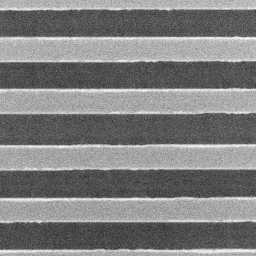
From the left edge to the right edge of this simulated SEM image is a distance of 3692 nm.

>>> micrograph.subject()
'lines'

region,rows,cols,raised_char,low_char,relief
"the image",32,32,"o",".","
oooooooooooooooooooooooooooooooo
................................
................................
................................
................................
oooooooooooooooooooooooooooooooo
oooooooooooooooooooooooooooooooo
oooooooooooooooooooooooooooooooo
................................
................................
................................
oooooooooooooooooooooooooooooooo
oooooooooooooooooooooooooooooooo
oooooooooooooooooooooooooooooooo
................................
................................
................................
................................
oooooooooooooooooooooooooooooooo
oooooooooooooooooooooooooooooooo
oooooooooooooooooooooooooooooooo
................................
................................
................................
................................
oooooooooooooooooooooooooooooooo
oooooooooooooooooooooooooooooooo
oooooooooooooooooooooooooooooooo
................................
................................
................................
oooooooooooooooooooooooooooooooo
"